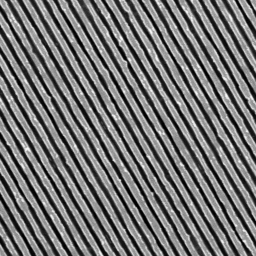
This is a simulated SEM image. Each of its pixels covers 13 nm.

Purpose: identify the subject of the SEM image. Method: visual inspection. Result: parallel lines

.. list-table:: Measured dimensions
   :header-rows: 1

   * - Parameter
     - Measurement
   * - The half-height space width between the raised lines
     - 0.058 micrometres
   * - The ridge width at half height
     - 0.082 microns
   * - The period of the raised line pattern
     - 136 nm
